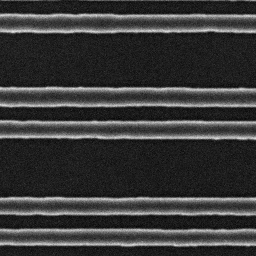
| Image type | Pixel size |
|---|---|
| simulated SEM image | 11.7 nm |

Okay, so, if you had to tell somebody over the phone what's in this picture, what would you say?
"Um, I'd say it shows lines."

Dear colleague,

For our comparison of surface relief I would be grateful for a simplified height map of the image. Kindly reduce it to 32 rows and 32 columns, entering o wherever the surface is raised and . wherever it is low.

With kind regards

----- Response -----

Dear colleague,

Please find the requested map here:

................................
................................
oooooooooooooooooooooooooooooooo
oooooooooooooooooooooooooooooooo
................................
................................
................................
................................
................................
................................
................................
oooooooooooooooooooooooooooooooo
oooooooooooooooooooooooooooooooo
................................
................................
oooooooooooooooooooooooooooooooo
oooooooooooooooooooooooooooooooo
................................
................................
................................
................................
................................
................................
................................
................................
oooooooooooooooooooooooooooooooo
oooooooooooooooooooooooooooooooo
................................
................................
oooooooooooooooooooooooooooooooo
oooooooooooooooooooooooooooooooo
................................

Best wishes